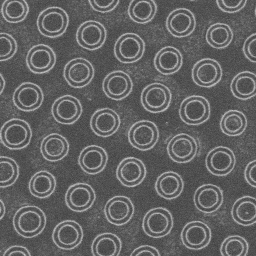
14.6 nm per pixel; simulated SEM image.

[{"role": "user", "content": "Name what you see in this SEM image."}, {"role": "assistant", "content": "a regular array of ring-shaped raised bodies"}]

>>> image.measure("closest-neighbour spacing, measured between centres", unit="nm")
567